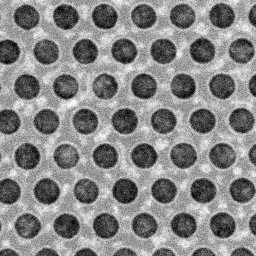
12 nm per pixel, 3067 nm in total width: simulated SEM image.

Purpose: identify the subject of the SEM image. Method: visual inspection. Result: a regular array of holes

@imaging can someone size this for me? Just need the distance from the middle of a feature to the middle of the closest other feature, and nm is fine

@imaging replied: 466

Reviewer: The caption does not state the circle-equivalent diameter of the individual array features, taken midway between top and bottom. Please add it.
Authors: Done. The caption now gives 0.327 micrometres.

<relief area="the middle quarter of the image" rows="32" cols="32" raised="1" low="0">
11111111111111111111111111111111
11111111111111111111111111111111
01111111100011111110001111110001
00011111000001111000000111100000
00001110000001111000000111100000
00001110000000111000000011000000
00001110000000111000000111100000
00011110000001111000000111100000
00011111000011111100001111110000
11111111111111111111111111111111
11111111111111111111111111111111
11100001111110000111111000011111
11000000111100000011110000001111
11000000011100000001100000001110
11000000011100000001100000001110
11000000011100000001110000001110
11100000111110000011110000001111
11110001111111000111111100111111
11111111111111111111111111111111
11111111111111111111111111111101
00011111000011111100001111100000
00001110000001111000000111100000
00001110000000110000000111000000
00001110000000111000000111000000
00001110000000111000000111100000
00011111000001111100001111110000
11111111111111111111111111111111
11111111111111111111111111111111
11111011111111001111111100111111
11100000111110000011110000001111
11000000011100000011110000001111
11000000011100000001100000000110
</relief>